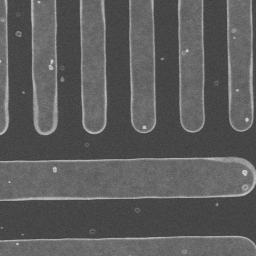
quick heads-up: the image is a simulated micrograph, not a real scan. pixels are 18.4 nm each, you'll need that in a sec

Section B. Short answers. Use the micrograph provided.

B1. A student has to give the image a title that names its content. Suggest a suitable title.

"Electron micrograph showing groups of lines, slits or small figures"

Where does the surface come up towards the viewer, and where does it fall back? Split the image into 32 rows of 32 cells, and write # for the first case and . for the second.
#...###...###...###...###...###.
#...###...###...###...###...###.
#...###...###...###...###....##.
#...###...###...###...###....###
#...###...###...###...###....###
#...###...###...###...###....###
#...###...###...###....##....###
#...###...###...###....##....###
#...###...###...###....##....##.
#...###...###...###....##....##.
#...###...###...###....##....##.
#...###...###...###....##....##.
#...###...###...###....##....###
#...###...###...###....##....###
#....##...###...###....##....###
#....##...###....##....##....##.
.....#.....#....................
................................
................................
................................
###############################.
################################
################################
################################
############################....
................................
................................
................................
................................
................................
################################
################################